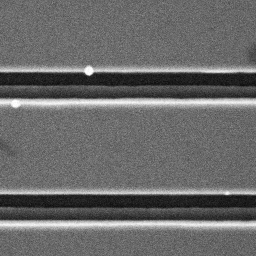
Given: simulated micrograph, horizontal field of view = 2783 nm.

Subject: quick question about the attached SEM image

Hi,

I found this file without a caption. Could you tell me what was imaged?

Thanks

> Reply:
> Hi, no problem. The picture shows lines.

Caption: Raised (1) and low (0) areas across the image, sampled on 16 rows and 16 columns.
1111111111111111
1111111111111111
1111111111111111
1111111111111111
0000010000000000
0000000000000000
1111111111111111
1111111111111111
1111111111111111
1111111111111111
1111111111111111
1111111111111111
0000000000000000
0000000000000000
1111111111111111
1111111111111111